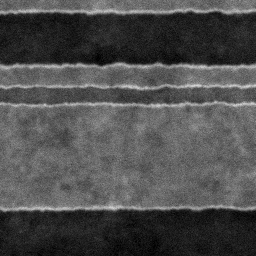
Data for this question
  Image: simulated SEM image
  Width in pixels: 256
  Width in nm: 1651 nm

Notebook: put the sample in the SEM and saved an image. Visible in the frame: lines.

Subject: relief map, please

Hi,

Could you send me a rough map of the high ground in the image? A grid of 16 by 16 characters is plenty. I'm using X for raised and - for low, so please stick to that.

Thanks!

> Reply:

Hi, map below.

XXXXXXXXXXXXXXXX
----------------
----------------
----------------
XXXXXXXXXXXXXXXX
XXXXXXXXXXXXXXXX
XXXXXXXXXXXXXXXX
XXXXXXXXXXXXXXXX
XXXXXXXXXXXXXXXX
XXXXXXXXXXXXXXXX
XXXXXXXXXXXXXXXX
XXXXXXXXXXXXXXXX
XXXXXXXXXXXXXXXX
----------------
----------------
----------------